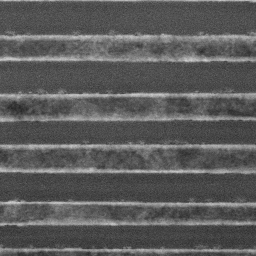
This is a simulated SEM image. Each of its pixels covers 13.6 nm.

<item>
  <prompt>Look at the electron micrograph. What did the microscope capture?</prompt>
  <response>lines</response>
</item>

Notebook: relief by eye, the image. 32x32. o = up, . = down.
................................
................................
................................
................................
................................
oooooooooooooooooooooooooooooooo
oooooooooooooooooooooooooooooooo
................................
................................
................................
................................
................................
oooooooooooooooooooooooooooooooo
oooooooooooooooooooooooooooooooo
oooooooooooooooooooooooooooooooo
................................
................................
................................
oooooooooooooooooooooooooooooooo
oooooooooooooooooooooooooooooooo
oooooooooooooooooooooooooooooooo
................................
................................
................................
................................
ooooooooooooooooo...............
oooooooooooooooooooooooooooooooo
oooooooooooooooooooooooooooooooo
................................
................................
................................
oooooooooooooooooooooooooooooooo